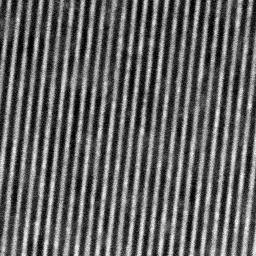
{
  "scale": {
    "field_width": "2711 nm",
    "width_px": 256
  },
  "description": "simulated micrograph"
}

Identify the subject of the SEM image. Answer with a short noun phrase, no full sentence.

parallel lines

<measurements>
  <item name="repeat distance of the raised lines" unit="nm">110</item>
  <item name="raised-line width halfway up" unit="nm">32.9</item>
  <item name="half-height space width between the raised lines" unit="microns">0.0816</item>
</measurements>